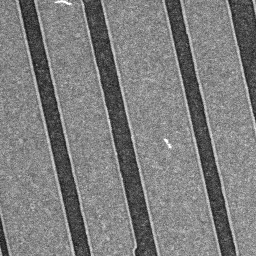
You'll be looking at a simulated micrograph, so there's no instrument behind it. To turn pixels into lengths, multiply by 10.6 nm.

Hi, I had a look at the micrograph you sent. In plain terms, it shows one or a few lines or trenches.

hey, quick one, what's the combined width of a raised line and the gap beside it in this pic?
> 762 nm